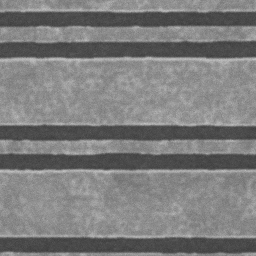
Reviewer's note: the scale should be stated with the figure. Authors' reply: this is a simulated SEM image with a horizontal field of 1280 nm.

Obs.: lines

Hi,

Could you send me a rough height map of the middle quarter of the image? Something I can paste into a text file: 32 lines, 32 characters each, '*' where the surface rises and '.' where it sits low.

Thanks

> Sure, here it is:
********************************
********************************
********************************
********************************
********************************
********************************
********************************
********************************
********************************
********************************
********************************
********************************
********************************
********************************
********************************
................................
................................
................................
................................
********************************
********************************
********************************
................................
................................
................................
................................
................................
********************************
********************************
********************************
********************************
********************************